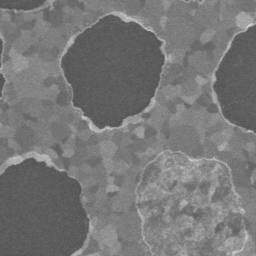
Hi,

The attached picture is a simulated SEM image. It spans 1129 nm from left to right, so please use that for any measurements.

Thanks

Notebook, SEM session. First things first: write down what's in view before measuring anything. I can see holes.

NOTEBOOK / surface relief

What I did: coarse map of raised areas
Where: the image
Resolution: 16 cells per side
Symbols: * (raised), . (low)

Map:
...*************
******...*******
****......*****.
****......****..
****......****..
****......***...
*****....*****..
*****...******..
****************
****************
....************
.....***********
.....***********
.....***********
......**********
.....***********